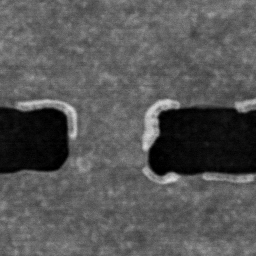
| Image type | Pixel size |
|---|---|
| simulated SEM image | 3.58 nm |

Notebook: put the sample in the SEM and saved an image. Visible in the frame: holes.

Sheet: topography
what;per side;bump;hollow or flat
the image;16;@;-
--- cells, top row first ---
@@@@@@@@@@@@@@@@
@@@@@@@@@@@@@@@@
@@@@@@@@@@@@@@@@
@@@@@@@@@@@@@@@@
@@@@@@@@@@@@@@@@
@@@@@@@@@@@@@@@@
@@@@@@@@@@@@@@@@
----@@@@@@------
----@@@@@@------
----@@@@@-------
----@@@@@-------
@@@@@@@@@@@@@@@@
@@@@@@@@@@@@@@@@
@@@@@@@@@@@@@@@@
@@@@@@@@@@@@@@@@
@@@@@@@@@@@@@@@@